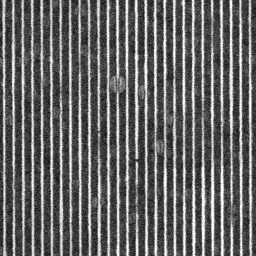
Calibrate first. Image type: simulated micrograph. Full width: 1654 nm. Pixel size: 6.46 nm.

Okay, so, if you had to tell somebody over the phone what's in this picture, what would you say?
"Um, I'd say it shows parallel lines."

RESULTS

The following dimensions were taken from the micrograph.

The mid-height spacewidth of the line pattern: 52.5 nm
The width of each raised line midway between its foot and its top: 9.7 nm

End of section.